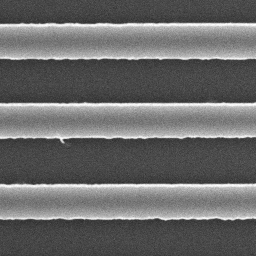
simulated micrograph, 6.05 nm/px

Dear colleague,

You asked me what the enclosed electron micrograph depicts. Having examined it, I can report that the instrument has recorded lines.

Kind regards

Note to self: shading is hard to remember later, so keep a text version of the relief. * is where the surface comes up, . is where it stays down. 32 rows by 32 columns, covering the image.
................................
................................
................................
********************************
********************************
********************************
********************************
................................
................................
................................
................................
................................
................................
********************************
********************************
********************************
********************************
................................
................................
................................
................................
................................
................................
********************************
********************************
********************************
********************************
................................
................................
................................
................................
................................